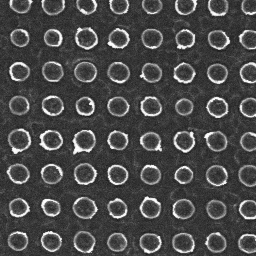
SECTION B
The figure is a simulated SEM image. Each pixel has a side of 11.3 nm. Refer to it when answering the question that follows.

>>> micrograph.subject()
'a regular array of raised bodies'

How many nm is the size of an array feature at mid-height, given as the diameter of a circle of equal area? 224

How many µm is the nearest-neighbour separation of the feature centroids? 0.369